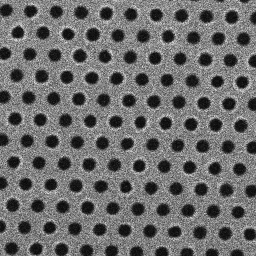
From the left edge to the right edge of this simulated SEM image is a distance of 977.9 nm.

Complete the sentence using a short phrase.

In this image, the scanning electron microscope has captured a regular array of holes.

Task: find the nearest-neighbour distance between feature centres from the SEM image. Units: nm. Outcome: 94.5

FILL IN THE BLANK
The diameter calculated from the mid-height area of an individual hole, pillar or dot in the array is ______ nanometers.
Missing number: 47